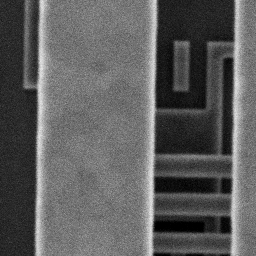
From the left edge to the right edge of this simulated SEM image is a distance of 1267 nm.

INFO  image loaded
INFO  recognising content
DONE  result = wiring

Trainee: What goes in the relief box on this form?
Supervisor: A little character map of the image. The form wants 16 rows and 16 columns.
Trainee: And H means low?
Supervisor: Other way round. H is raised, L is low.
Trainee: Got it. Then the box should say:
LLLHHHHHHHLLLLLH
LLHHHHHHHHLLLLLH
LLHHHHHHHHLLLLLH
LLHHHHHHHHLLLLLH
LLHHHHHHHHLLLLLH
LLHHHHHHHHLLLLLH
LLHHHHHHHHLLLLLH
LLHHHHHHHHLLLLLH
LLHHHHHHHHLLLLLH
LLHHHHHHHHLLLLLH
LLHHHHHHHHLLLLLH
LLHHHHHHHHLLLLLH
LLHHHHHHHHLLLLLH
LLHHHHHHHHLLLLLH
LLHHHHHHHHLLLLLH
LLHHHHHHHLLLLLLH